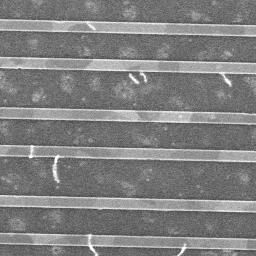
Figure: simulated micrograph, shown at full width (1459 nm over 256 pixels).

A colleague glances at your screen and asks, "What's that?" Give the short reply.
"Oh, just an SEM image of parallel lines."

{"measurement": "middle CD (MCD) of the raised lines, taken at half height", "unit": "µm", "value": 0.0556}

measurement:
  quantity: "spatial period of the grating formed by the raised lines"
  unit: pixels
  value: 42.7